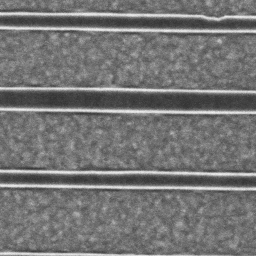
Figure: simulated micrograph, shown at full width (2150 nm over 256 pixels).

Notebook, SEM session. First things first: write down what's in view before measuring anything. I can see one or a few lines or trenches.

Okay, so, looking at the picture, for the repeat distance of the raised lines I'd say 0.661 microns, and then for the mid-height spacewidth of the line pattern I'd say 504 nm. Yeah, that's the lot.